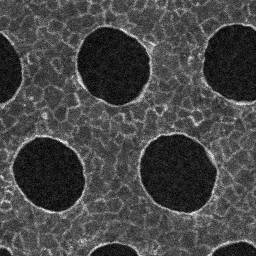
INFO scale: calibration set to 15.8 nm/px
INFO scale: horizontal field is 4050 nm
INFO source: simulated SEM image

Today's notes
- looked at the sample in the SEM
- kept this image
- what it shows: holes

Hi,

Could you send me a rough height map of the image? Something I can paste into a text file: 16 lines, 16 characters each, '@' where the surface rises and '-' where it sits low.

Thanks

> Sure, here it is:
@@@@@@@@@@@@@@@@
@@@@@@@@@@@@@@@@
-@@@@----@@@@---
-@@@@----@@@@---
-@@@@----@@@@---
-@@@@----@@@@---
@@@@@@@-@@@@@@@@
@@@@@@@@@@@@@@@@
@@@@@@@@@@--@@@@
@----@@@@----@@@
@----@@@@----@@@
@----@@@@----@@@
@@---@@@@@---@@@
@@@@@@@@@@@@@@@@
@@@@@@@@@@@@@@@@
@@@@@@--@@@@@@--